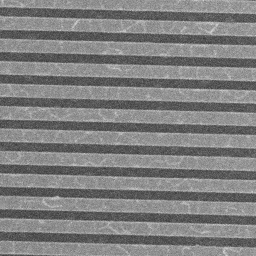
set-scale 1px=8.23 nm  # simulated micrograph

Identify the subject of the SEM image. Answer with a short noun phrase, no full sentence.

parallel lines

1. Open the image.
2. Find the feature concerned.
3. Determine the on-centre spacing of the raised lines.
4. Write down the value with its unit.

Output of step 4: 0.184 um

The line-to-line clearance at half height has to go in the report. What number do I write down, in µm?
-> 0.0833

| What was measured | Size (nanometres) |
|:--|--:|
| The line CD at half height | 101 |